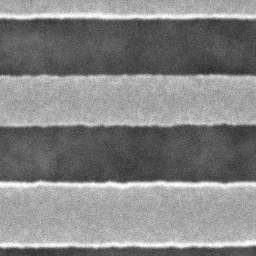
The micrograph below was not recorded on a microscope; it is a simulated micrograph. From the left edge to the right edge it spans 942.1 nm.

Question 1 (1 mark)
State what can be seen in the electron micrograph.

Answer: lines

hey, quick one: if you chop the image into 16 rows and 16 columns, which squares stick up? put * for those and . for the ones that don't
****************
................
................
................
................
****************
****************
****************
................
................
................
*******.********
****************
****************
****************
................